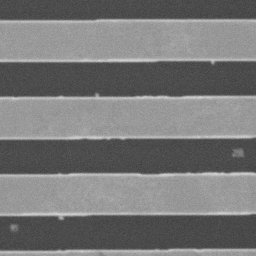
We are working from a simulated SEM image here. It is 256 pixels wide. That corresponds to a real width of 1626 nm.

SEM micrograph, lines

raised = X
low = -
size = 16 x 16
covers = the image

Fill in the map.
----------------
XXXXXXXXXXXXXXXX
XXXXXXXXXXXXXXXX
XXXXXXXXXXXXXXXX
----------------
----------------
XXXXXXXXXXXXXXXX
XXXXXXXXXXXXXXXX
XXXXXXXXXXXXXXXX
----------------
----------------
XXXXXXXXXXXXXXXX
XXXXXXXXXXXXXXXX
----------------
----------------
----------------